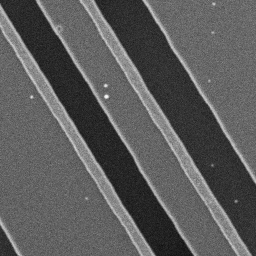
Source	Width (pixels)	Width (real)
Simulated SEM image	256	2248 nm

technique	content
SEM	lines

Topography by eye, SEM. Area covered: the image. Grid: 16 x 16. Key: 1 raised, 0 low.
0001110001111111
1001111000111111
1000111000111111
1100111100011111
1110011110001111
1110001110001111
1111001111000111
1111000111000011
1111100111100011
1111110011110001
1111110001110001
1111111001111000
1111111000111100
1111111100011100
1111111110011110
0111111110001110